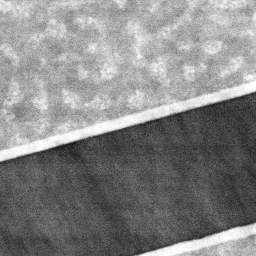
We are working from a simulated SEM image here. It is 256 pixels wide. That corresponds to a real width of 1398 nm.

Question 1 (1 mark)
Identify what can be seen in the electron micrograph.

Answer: one or a few lines or trenches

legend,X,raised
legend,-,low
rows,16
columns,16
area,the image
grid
XXXXXXXXXXXXXXXX
XXXXXXXXXXXXXXXX
XXXXXXXXXXXXXXXX
XXXXXXXXXXXXXXXX
XXXXXXXXXXXXXXXX
XXXXXXXXXXXXXXXX
XXXXXXXXXXXX----
XXXXXXXX--------
XXXX------------
X---------------
----------------
----------------
----------------
----------------
---------------X
-----------XXXXX